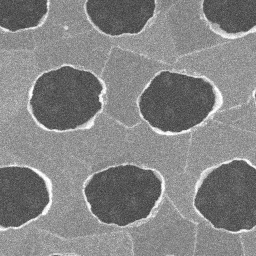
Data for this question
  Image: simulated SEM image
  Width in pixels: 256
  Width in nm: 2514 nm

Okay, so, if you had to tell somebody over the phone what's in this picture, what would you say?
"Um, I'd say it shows holes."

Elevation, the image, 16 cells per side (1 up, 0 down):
0001100000111000
0011110001111000
1111111111111111
1111111111111111
1110011111011111
1100001110000111
1100001110000111
1100001110000111
1111111111111111
1111111111111111
0011111001111000
0001100000110000
0001100000110000
0011110001111000
1111111111111111
1111111111111111